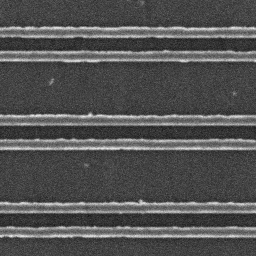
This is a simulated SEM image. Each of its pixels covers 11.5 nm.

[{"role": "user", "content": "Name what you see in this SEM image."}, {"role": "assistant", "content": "lines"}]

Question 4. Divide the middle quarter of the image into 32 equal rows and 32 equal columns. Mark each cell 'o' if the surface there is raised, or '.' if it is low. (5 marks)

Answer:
................................
................................
................................
................................
................................
................................
................................
................................
................................
................................
................................
................................
................................
oooooooooooooooooooooooooooooooo
oooooooooooooooooooooooooooooooo
................................
................................
................................
................................
oooooooooooooooooooooooooooooooo
oooooooooooooooooooooooooooooooo
................................
................................
................................
................................
................................
................................
................................
................................
................................
................................
................................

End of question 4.